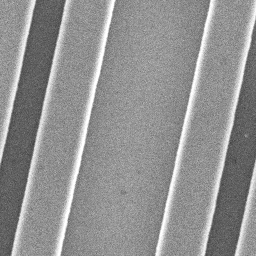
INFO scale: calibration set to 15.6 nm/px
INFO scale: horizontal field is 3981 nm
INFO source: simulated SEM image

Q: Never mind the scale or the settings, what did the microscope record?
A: lines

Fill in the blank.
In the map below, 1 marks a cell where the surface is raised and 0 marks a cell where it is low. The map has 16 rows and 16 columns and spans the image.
1100111000000111
1100111000000111
1100111000000111
1001110000001110
1001110000001110
1001110000001110
1001110000001110
1001110000001110
0011100000011100
0011100000011100
0011100000011100
0011100000011100
0111000000111001
0111000000111001
0111000000111001
0111000000111001